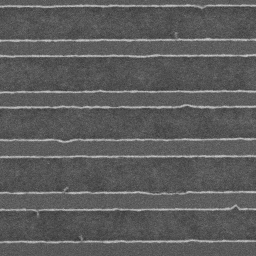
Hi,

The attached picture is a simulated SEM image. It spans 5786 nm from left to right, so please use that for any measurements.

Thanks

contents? parallel lines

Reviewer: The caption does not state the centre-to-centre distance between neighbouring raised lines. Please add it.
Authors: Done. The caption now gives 51 px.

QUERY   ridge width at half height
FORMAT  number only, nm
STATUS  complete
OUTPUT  364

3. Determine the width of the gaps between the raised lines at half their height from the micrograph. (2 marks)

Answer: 768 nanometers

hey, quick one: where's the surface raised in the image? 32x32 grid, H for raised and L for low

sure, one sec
HHHHHHHHHHHHHHHHHHHHHHHHHHHHHHHH
LLLLLLLLLLLLLLLLLLLLLLLLLLLLLLLL
LLLLLLLLLLLLLLLLLLLLLLLLLLLLLLLL
LLLLLLLLLLLLLLLLLLLLLLLLLLLLLLLL
LLLLLLLLLLLLLLLLLLLLLLLLLLLLLLLL
HHHHHHHHHHHHHHHHHHHHHHHHHHHHHHHH
HHHHHHHHHHHHHHHHHHHHHHHHHHHHHHHH
LLLLLLLLLLLLLLLLLLLLLLLLLLLLLLLL
LLLLLLLLLLLLLLLLLLLLLLLLLLLLLLLL
LLLLLLLLLLLLLLLLLLLLLLLLLLLLLLLL
LLLLLLLLLLLLLLLLLLLLLLLLLLLLLLLL
HLHHHHHHLLHHHHLHHHLLHHHLHLHHHHHH
HHHHHHHHHHHHHHHHHHHHHHHHHHHHHHHH
LLLLLLLLLLLLLLLLLLLLLLLLLLLLLLLL
LLLLLLLLLLLLLLLLLLLLLLLLLLLLLLLL
LLLLLLLLLLLLLLLLLLLLLLLLLLLLLLLL
LLLLLLLLLLLLLLLLLLLLLLLLLLLLLLLL
LLLLLLLLLHHHHHLHHHHHHHHHHHHHHHHH
HHHHHHHHHHHHHHHHHHHHHHHHHHHHHHHH
HHHHHHHHHLLHHHHLHHHHHHHHHHHHHHHH
LLLLLLLLLLLLLLLLLLLLLLLLLLLLLLLL
LLLLLLLLLLLLLLLLLLLLLLLLLLLLLLLL
LLLLLLLLLLLLLLLLLLLLLLLLLLLLLLLL
LLLLLLLLLLLLLLLLLLLLLLLLLLLLLLLL
HHHHHHHHHHHHHHHHHHHHHHHHHHHHHHHH
HHHHHHHHHHHHHHHHHHHHHHHHHHHHHHHH
LLLLLLLLLLLLLLLLLLLLLLLLLLLLLLLL
LLLLLLLLLLLLLLLLLLLLLLLLLLLLLLLL
LLLLLLLLLLLLLLLLLLLLLLLLLLLLLLLL
LLLLLLLLLLLLLLLLLLLLLLLLLLLLLLLL
HHHHHHHHHHHHHHHHHHHHHHHHHHHHHHHH
HHHHHHHHHHHHHHHHHHHHHHHHHHHHHHHH